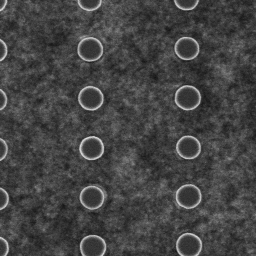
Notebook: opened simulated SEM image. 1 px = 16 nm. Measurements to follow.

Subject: a regular array of raised bodies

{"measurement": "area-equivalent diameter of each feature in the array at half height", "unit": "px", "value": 23.8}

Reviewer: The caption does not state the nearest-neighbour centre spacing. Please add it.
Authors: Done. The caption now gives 789 nm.